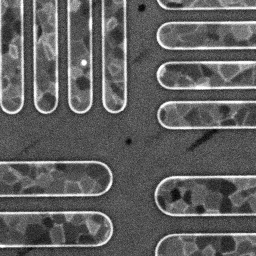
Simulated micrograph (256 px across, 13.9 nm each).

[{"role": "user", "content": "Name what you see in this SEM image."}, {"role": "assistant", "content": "groups of lines, slits or small figures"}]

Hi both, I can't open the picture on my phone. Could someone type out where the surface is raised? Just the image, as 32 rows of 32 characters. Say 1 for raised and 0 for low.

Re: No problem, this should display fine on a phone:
11101110011001110000111111111111
11101110011001110000000000000000
11101110011001110000000000000000
11101110011001110000111111111111
11101110011001110000111111111111
11101110011001110000111111111111
11101110011001110000000000000000
11101110011001110000000000000000
11101110011001110000111111111111
11101110011001110000111111111111
11101110011001110000111111111111
11101110011001110000000000000000
11101110011001110000000000000000
11100110011001100000111111111111
00000000000000000000111111111111
00000000000000000000111111111111
00000000000000000000000000000000
00000000000000000000000000000000
00000000000000000000000000000000
00000000000000000000000000000000
11111111111110000000000000000000
11111111111111000000000000000000
11111111111111000000011111111111
11111111111111000000111111111111
00000000000000000001111111111111
00000000000000000000111111111111
00000000000000000000011111111111
11111111111111000000000000000000
11111111111111000000000000000000
11111111111111000000011111111111
11111111111110000000111111111111
00000000000000000000111111111111